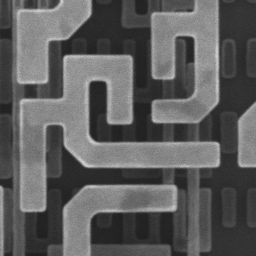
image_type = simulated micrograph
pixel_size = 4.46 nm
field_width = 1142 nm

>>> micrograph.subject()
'wiring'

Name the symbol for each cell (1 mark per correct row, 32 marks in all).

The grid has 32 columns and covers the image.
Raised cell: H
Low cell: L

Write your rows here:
LLLLLLLHHHHLLLLLLLLLLLLLHHHLLLLL
LLHHHHHHHHHLLLLLLLLLLLLLHHHLLLLL
LLHHHHHHHHHLLLLLLLLHHHHHHHHLLLLL
LLHHHHHHHHLLLLLLLLLHHHHHHHHLLLLL
LLHHHHHHHLLLLLLLLLLHHHHLHHHLLLLL
LLHHHHLLLLLLLLLLLLLHHHLLHHHLLLLL
LLHHHHLLLLLLLLLLLLLHHHLLHHHLLLLL
LLHHHHLLHHHHHHHHHLLHHHLLHHHLLLLL
LLHHHHLLHHHHHHHHHLLHHHLLHHHLLLLL
LLHHHHLLHHHHHHHHHLLHHHLLHHHLLLLL
LLLLLLLLHHHLLHHHHLLLLLLLHHHLLLLL
LLLLLLLLHHHLLHHHHLLLLLLLHHHLLLLL
LLLHHHHHHHHLLHHHHLLLLLLHHHHLLLLL
LLLHHHHHHHHLLHHHHLLHHHHHHHHLLLLH
LLLHHHHHHHHLLHHHHLLHHHHHHHLLLLHH
LLLHHHLHHHHLLLLLLLLLLLLLLLLLLLHH
LLLHHHLLHHHLLLLLLLLLLLLLLLLLLLHH
LLLHHHLLHHHHLLLLLLLLLLLLLLLLLLHH
LLLHHHLLHHHHHHHHHHHHHHHHHHHLLLHH
LLLHHHLLLHHHHHHHHHHHHHHHHHHLLLHH
LLLHHHLLLLHHHHHHHHHHHHHHHHHLLLHH
LLLHHHLLLLLLLLLLLLLLLLLLLLLLLLLL
LLLHHHLLLLLLLLLLLLLLLLLLLLLLLLLL
LLLHHHLLLLHHHHHHHHHHHHLLLLLLLLLL
LLLHHHLLLHHHHHHHHHHHHHLLLLLLLLLL
LLLHHHLLHHHHHHHHHHHHHHLLLLLLLLLL
LLLLLLLLHHHHHLLLLLLLLLLLLLLLLLLL
LLLLLLLLHHHLLLLLLLLLLLLLLLLLLLLL
LLLLLLLLHHHLLLLLLLLLLLLLLLLLLLLL
LLLLLLLLHHHLLLLLLLLLLLLLLLLLLLLL
LLLLLLLLHHHLLLLLLLLLLLLLLLLLLLLL
LLLLLLLLHHHLLLLLLLLLLLLLLLLLLLLL